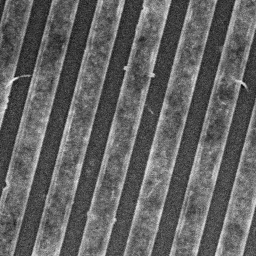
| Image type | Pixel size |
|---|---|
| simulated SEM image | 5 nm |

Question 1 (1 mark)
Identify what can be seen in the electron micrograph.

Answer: parallel lines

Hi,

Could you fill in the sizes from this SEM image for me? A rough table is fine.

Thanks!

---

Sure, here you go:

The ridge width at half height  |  129 nanometres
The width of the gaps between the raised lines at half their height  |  92.5 nm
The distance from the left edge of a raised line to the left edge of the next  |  222 nm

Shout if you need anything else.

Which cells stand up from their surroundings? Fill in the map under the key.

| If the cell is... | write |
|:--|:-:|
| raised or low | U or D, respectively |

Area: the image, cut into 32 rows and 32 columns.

DUUUDDUUUUDDUUUUDDUUUDDDUUUDDUUU
UUUUDDUUUUDDUUUDDDUUUDDUUUUDDUUU
UUUUDDUUUDDDUUUDDUUUUDDUUUDDDUUU
UUUDDDUUUDDUUUUDDUUUDDDUUUDDDUUU
UUUDDUUUUDDUUUDDDUUUDDDUUUDDUUUU
UUUDDUUUDDDUUUDDDUUUDDUUUUDDUUUD
UUUDDUUUDDDUUUDDUUUUDDUUUDDDUUUD
UUDDDUUUDDUUUUDDUUUDDDUUUDDDUUUD
UUDDUUUUDDUUUDDDUUUDDDUUUDDUUUUD
UUDDUUUDDDUUUDDDUUUDDUUUUDDUUUDD
UDDDUUUDDDUUUDDUUUUDDUUUDDDUUUDD
UDDDUUUDDUUUUDDUUUDDDUUUDDDUUUDD
UDDUUUUDDUUUDDDUUUDDDUUUDDUUUUDD
UDDUUUDDDUUUDDDUUUDDUUUUDDUUUDDD
DDDUUUDDUUUUDDUUUUDDUUUDDDUUUDDU
DDDUUUDDUUUUDDUUUDDDUUUDDUUUUDDU
DDUUUUDDUUUDDDUUUDDDUUUDDUUUUDDU
DDUUUDDDUUUDDDUUUDDUUUUDDUUUDDDU
DDUUUDDDUUUDDUUUUDDUUUDDDUUUDDUU
DDUUUDDUUUUDDUUUDDDUUUDDUUUUDDUU
DUUUUDDUUUDDDUUUDDUUUUDDUUUUDDUU
DUUUDDDUUUDDUUUUDDUUUUDDUUUDDDUU
DUUUDDUUUUDDUUUUDDUUUDDDUUUDDUUU
DUUUDDUUUUDDUUUDDDUUUDDUUUUDDUUU
UUUUDDUUUDDDUUUDDUUUUDDUUUDDDUUU
UUUDDDUUUDDUUUUDDUUUDDDUUUDDDUUU
UUUDDUUUUDDUUUUDDUUUDDDUUUDDUUUU
UUUDDUUUUDDUUUDDDUUUDDUUUUDDUUUD
UUUDDUUUDDDUUUDDUUUUDDUUUDDDUUUD
UUDDDUUUDDUUUUDDUUUDDDUUUDDDUUUD
UUDDUUUUDDUUUDDDUUUDDDUUUDDUUUUD
UUDDUUUDDDUUUDDDUUUDDUUUUDDUUUDD